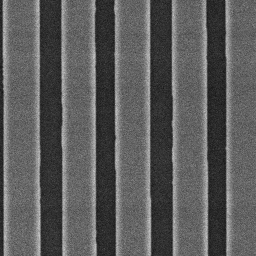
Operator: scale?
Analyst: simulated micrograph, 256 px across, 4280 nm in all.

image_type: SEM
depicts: lines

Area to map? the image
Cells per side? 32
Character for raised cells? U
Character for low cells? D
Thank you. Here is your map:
UUUUUDDDUUUUDDUUUUUDDDUUUUDDUUUU
UUUUUDDDUUUUDDUUUUUDDDUUUUDDUUUU
UUUUUDDDUUUUDDUUUUUDDDUUUUDDUUUU
UUUUUDDDUUUUDDUUUUUDDDUUUUDDUUUU
UUUUUDDDUUUUDDUUUUUDDDUUUUDDUUUU
UUUUUDDDUUUUDDUUUUUDDDUUUUDDUUUU
UUUUUDDDUUUUDDUUUUUDDDUUUUDDUUUU
UUUUUDDDUUUUDDUUUUUDDDUUUUDDUUUU
UUUUUDDDUUUUDDUUUUUDDDUUUUDDUUUU
UUUUUDDDUUUUDDUUUUUDDDUUUUDDUUUU
UUUUUDDDUUUUDDUUUUUDDDUUUUDDUUUU
DUUUUDDDUUUUDDUUUUUDDDUUUUDDUUUU
DUUUUDDDUUUUDDUUUUUDDDUUUUDDUUUU
DUUUUDDDUUUUDDUUUUUDDDUUUUDDUUUU
DUUUUDDDUUUUDDUUUUUDDDUUUUDDUUUU
DUUUUDDDUUUUDDUUUUUDDDUUUUDDUUUU
DUUUUDDDUUUUDDUUUUUDDDUUUUDDUUUU
DUUUUDDDUUUUDDUUUUUDDDUUUUDDUUUU
DUUUUDDDUUUUDDUUUUUDDDUUUUDDUUUU
DUUUUDDDUUUUDDUUUUUDDDUUUUDDUUUU
DUUUUDDDUUUUDDUUUUUDDDUUUUDDUUUU
DUUUUDDDUUUUDDUUUUUDDDUUUUDDUUUU
DUUUUDDDUUUUDDDUUUUDDDUUUUDDUUUU
DUUUUDDDUUUUDDDUUUUDDDUUUUDDUUUU
DUUUUDDDUUUUDDDUUUUDDDUUUUDDUUUU
DUUUUDDDUUUUDDDUUUUDDDUUUUDDUUUU
DUUUUDDDUUUUDDDUUUUDDDUUUUDDUUUU
DUUUUDDDUUUUDDDUUUUDDDUUUUDDUUUU
DUUUUDDDUUUUDDDUUUUDDDUUUUDDUUUU
DUUUUDDDUUUUDDDUUUUDDDUUUUDDUUUU
DUUUUDDDUUUUDDDUUUUDDDUUUUDDUUUU
DUUUUDDDUUUUDDDUUUUDDDUUUUDDUUUU